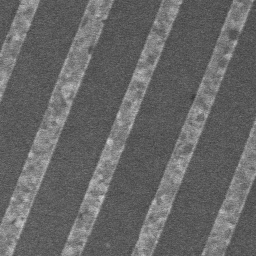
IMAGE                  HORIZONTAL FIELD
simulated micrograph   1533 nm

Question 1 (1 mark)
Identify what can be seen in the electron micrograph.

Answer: one or a few lines or trenches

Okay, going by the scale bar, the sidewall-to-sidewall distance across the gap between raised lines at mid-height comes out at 286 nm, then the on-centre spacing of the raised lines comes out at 65.9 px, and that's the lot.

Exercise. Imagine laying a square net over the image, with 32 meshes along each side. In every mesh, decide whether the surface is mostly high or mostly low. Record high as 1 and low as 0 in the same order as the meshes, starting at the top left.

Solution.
00011000000111000000111000000110
00110000000110000000110000000110
00110000001110000001110000001110
01100000001110000001100000001100
01100000011100000001100000001100
01100000011100000011000000011000
11000000011000000011000000011000
11000000111000000011000000111000
10000000111000000110000000110000
10000001110000000110000000110000
10000001110000001100000001100000
00000001100000001100000001100000
00000011100000001100000011100000
00000011100000011000000011000000
00000111000000011000000011000000
00000111000000111000000110000000
00000110000000110000000110000001
00001110000000110000001110000001
00001110000001100000001100000001
00001100000001100000001100000011
00011100000011100000011000000011
00011000000011000000011000000011
00111000000011000000111000000111
00111000000110000000110000000110
00110000000110000001110000001110
01110000001110000001100000001100
01100000001100000001100000011100
11100000001100000011100000011100
11100000011000000011000000011000
11000000011000000011000000111000
11000000111000000110000000110000
11000000110000000110000001110000